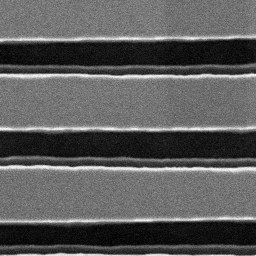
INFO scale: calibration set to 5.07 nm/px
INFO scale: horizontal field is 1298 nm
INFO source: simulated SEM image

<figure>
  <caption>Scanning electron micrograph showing lines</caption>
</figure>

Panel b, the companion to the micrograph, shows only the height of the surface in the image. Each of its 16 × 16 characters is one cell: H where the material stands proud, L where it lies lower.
HHHHHHHHHHHHHHHH
HHHHHHHHHHHHHHHH
HLLLLLLLLLLLLLLL
LLLLLLLLLLLLLLLL
LLLLLLLLLLLLLLLL
HHHHHHHHHHHHHHHH
HHHHHHHHHHHHHHHH
HHHHHHHHHHHHHHHH
LLLLLLLLLLLLLLLL
LLLLLLLLLLLLLLLL
HHHHHHHHHHHHHHHH
HHHHHHHHHHHHHHHH
HHHHHHHHHHHHHHHH
HHHHHHHHHHHHHHHH
LLLLLLLLLLLLLLLL
LLLLLLLLLLLLLLLL